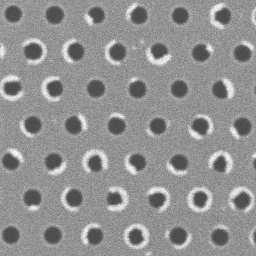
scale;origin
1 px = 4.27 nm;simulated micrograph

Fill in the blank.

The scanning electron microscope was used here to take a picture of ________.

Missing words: a regular array of holes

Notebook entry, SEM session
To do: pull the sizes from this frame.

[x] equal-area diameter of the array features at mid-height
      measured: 70.1 nm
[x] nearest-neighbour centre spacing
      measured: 177 nanometers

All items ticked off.